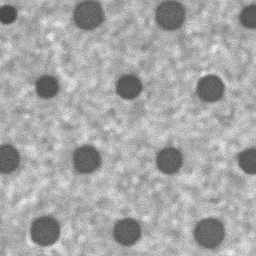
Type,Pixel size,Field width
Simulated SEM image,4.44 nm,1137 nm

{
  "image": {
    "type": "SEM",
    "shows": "a regular array of holes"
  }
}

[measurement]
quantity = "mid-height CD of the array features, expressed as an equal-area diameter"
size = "128 nm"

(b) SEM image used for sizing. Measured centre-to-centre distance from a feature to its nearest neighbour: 363 nm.